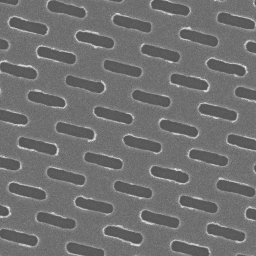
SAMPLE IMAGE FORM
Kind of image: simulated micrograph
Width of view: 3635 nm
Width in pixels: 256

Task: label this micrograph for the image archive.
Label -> a regular array of holes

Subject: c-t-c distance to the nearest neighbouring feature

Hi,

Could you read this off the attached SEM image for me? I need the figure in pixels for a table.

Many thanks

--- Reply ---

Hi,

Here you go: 40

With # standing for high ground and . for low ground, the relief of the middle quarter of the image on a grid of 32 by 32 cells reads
##########.......###############
###########........#############
###############....########.####
....#######################.....
.........##################.....
#.........###################...
######....########.#############
#################......#########
#################.........######
####################.......#####
########################..######
########....####################
########........################
##########.......###############
##############...#######....####
....####################........
.......##################.......
........#####################...
#####..########....#############
###############........#########
################........########
####################....########
#####....######################.
#####........###################
######.........#################
#########......#################
######################......####
....##################.........#
.....###################.......#
#....########..#############...#
############.......#############
#############.........##########